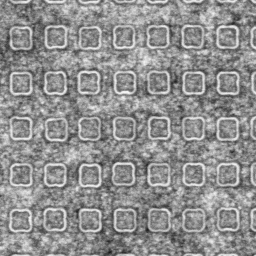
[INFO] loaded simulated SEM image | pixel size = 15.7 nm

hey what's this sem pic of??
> a regular array of raised bodies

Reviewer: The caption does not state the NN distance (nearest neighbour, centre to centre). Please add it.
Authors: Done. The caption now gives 0.536 microns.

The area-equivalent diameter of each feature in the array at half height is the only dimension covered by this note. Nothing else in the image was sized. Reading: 368 nanometres